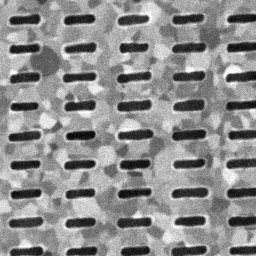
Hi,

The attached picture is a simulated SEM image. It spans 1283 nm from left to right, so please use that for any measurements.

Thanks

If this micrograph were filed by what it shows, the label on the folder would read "a regular array of holes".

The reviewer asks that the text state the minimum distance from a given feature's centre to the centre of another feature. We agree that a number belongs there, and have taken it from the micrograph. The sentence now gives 144 nm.